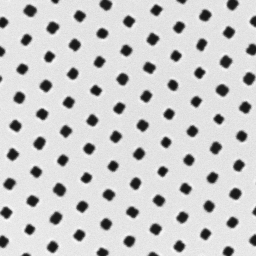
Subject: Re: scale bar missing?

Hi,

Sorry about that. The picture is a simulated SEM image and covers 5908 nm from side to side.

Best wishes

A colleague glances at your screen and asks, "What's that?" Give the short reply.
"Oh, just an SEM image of a regular array of holes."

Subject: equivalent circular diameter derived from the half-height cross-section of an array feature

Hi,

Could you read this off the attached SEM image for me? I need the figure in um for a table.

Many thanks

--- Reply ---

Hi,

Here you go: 0.273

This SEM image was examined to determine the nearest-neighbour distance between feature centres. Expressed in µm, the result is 0.66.